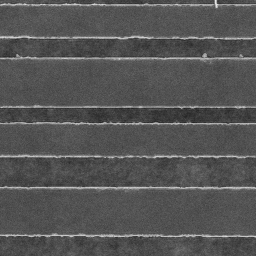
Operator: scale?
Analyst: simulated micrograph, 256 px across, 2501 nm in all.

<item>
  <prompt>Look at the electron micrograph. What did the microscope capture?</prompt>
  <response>lines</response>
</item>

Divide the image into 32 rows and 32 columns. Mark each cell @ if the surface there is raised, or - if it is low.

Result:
--------------------------------
@@@@@@@@@@@@@@@@@@@@@@@@@@@@@@@@
@@@@@@@@@@@@@@@@@@@@@@@@@@@@@@@@
@@@@@@@@@@@@@@@@@@@@@@@@@@@@@@@@
@@@@@@@@@@@@@@@@@@@@@@@@@@@@@@@@
--------------------------------
--------------------------------
@@@@@@@@@@@@@@@@@@@@@@@@@@@@@@@@
@@@@@@@@@@@@@@@@@@@@@@@@@@@@@@@@
@@@@@@@@@@@@@@@@@@@@@@@@@@@@@@@@
@@@@@@@@@@@@@@@@@@@@@@@@@@@@@@@@
@@@@@@@@@@@@@@@@@@@@@@@@@@@@@@@@
@@@@@@@@@@@@@@@@@@@@@@@@@@@@@@@@
--------------------------------
--------------------------------
@@@@@@@@@@@@@@@@@@@@@@@@@@@@@@@@
@@@@@@@@@@@@@@@@@@@@@@@@@@@@@@@@
@@@@@@@@@@@@@@@@@@@@@@@@@@@@@@@@
@@@@@@@@@@@@@@@@@@@@@@@@@@@@@@@@
@@---@@@@@@@@@@@@@@@@@@@@@@@@@@@
--------------------------------
--------------------------------
--------------------------------
@@@@@@@@@@@@@@@@@@@@@@@@@@@@@@@@
@@@@@@@@@@@@@@@@@@@@@@@@@@@@@@@@
@@@@@@@@@@@@@@@@@@@@@@@@@@@@@@@@
@@@@@@@@@@@@@@@@@@@@@@@@@@@@@@@@
@@@@@@@@@@@@@@@@@@@@@@@@@@@@@@@@
@@@@@@@@@@@@@@@@@@@@@@@@@@@@@@@@
---@@@@-@-@@@@@@@@@@@@@@@@@@@@@@
--------------------------------
--------------------------------